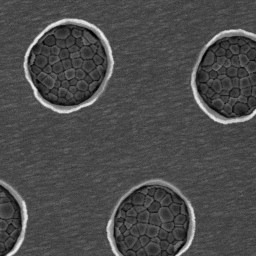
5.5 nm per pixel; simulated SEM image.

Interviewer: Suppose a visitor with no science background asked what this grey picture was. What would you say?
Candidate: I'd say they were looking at holes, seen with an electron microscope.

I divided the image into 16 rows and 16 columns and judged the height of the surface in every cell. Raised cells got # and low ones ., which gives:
################
####.###########
##....########..
##.....######...
##.....#####....
##....######....
###..########...
################
################
################
################
#########.######
.#######....####
.######.....####
.######.....####
.######....#####